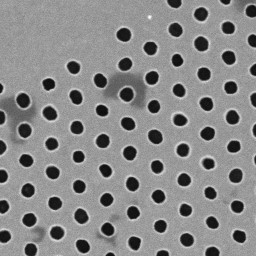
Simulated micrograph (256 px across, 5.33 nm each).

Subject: a regular array of holes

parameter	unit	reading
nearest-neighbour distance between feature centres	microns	0.156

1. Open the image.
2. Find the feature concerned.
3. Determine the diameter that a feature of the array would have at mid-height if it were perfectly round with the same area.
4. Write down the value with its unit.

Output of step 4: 73.1 nanometres